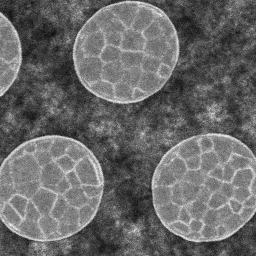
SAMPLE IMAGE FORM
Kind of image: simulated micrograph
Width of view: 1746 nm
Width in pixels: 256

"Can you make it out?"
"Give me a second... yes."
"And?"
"raised bodies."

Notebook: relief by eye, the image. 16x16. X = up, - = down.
------XXXX------
X----XXXXXX-----
X----XXXXXX-----
X----XXXXXX-----
X----XXXXXX-----
-----XXXXX------
----------------
----------------
------------XX--
-XXXXX-----XXXXX
XXXXXX----XXXXXX
XXXXXX----XXXXXX
XXXXXX----XXXXXX
XXXXXX----XXXXXX
-XXXX------XXXX-
----------------